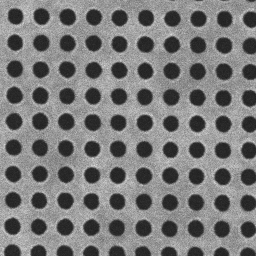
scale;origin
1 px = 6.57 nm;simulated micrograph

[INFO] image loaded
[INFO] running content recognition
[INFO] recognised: a regular array of holes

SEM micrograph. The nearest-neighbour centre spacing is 170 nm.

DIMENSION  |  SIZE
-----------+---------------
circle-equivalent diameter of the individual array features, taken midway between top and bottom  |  106 nanometers